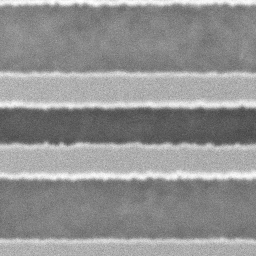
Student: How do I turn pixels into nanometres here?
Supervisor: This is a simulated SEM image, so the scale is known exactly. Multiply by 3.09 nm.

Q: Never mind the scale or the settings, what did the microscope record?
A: lines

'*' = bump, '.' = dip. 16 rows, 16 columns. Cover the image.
................
................
................
................
................
****************
****************
................
................
****************
****************
................
................
................
................
****************